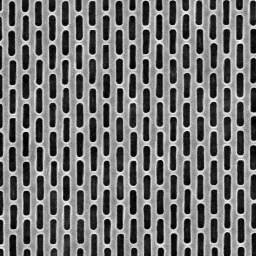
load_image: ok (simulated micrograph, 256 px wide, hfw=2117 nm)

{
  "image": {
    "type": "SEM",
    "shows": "a regular array of holes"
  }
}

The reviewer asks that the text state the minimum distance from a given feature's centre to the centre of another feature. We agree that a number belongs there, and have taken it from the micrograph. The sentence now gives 159 nm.